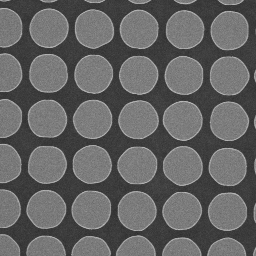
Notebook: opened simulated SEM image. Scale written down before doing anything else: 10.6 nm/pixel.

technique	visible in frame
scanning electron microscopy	an array of small figures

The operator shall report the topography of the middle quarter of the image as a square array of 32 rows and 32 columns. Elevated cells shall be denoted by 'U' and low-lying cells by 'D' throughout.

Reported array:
UDDUUUUUUUUUDDUUUUUUUUUDDDUUUUUU
UDDUUUUUUUUUDDUUUUUUUUUDDUUUUUUU
UDDUUUUUUUUUDDUUUUUUUUUDDUUUUUUU
UDDUUUUUUUUUDDUUUUUUUUUDDUUUUUUU
UDDUUUUUUUUUDDUUUUUUUUUDDUUUUUUU
DDDDUUUUUUUDDDDUUUUUUUDDDDUUUUUU
DDDDDUUUUUDDDDDUUUUUUUDDDDDUUUUU
DDDDDDDDDDDDDDDDDDUUDDDDDDDDUUUU
DDDDDDDDDDDDDDDDDDDDDDDDDDDDDDDD
DDDDDUUUUUDDDDDDDUUUUDDDDDDDDUUD
DDDDUUUUUUUDDDDUUUUUUUDDDDUUUUUU
DDDUUUUUUUUDDDDUUUUUUUUDDUUUUUUU
UDDUUUUUUUUUDDUUUUUUUUUDDUUUUUUU
UDUUUUUUUUUUDDUUUUUUUUUUDUUUUUUU
UDUUUUUUUUUUDDUUUUUUUUUUDUUUUUUU
DDDUUUUUUUUUDDUUUUUUUUUDDUUUUUUU
DDDUUUUUUUUDDDUUUUUUUUUDDDUUUUUU
DDDDUUUUUUDDDDDUUUUUUUDDDDDUUUUU
DDDDDDUUDDDDDDDDDUUUDDDDDDDDUUUU
DDDDDDDDDDDDDDDDDDDDDDDDDDDDDDDD
DDDDDDUUDDDDDDDDDDDDDDDDDDDDDDDD
DDDDUUUUUUDDDDDDUUUUUDDDDDDUUUUU
DDDUUUUUUUUDDDDUUUUUUUDDDDUUUUUU
DDUUUUUUUUUUDDUUUUUUUUUDDUUUUUUU
UDUUUUUUUUUUDUUUUUUUUUUDDUUUUUUU
UDUUUUUUUUUUDUUUUUUUUUUDDUUUUUUU
DDUUUUUUUUUUDUUUUUUUUUUDDUUUUUUU
DDDUUUUUUUUDDDUUUUUUUUUDDUUUUUUU
DDDUUUUUUUUDDDDUUUUUUUDDDDUUUUUU
DDDDDUUUUDDDDDDDUUUUUDDDDDDUUUUU
DDDDDDDDDDDDDDDDDDDDDDDDDDDDDDDD
DDDDDDDDDDDDDDDDDDDDDDDDDDDDDDDD